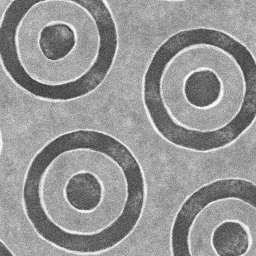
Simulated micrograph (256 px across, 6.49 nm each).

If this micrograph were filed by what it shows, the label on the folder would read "ring-shaped grooves with a dot in the middle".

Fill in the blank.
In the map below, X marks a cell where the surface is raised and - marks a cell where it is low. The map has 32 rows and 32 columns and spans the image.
X---XXXXXX---XXXXXXXXXXXXXXXXXXX
X--XXXXXXXX---XXXXXXXXXXXXXXXXXX
---XXXXXXXXX--XXXXXXXXXXXXXXXXXX
--XXXX---XXX--XXXXXXXXXXXXXXXXXX
--XXX----XXX---XXXXXX--------XXX
--XXX----XXX---XXXXX----------XX
--XXX----XXX--XXXXXX---XXXXX---X
--XXXX-XXXXX--XXXXX--XXXXXXXX---
X--XXXXXXXX---XXXXX--XXXXXXXXX--
X---XXXXXX---XXXXX--XXXX---XXX--
XX---XXX-----XXXXX--XXX-----XXX-
XXXX-------XXXXXXX--XXX-----XXX-
XXXXXXX-XXXXXXXXXX--XXX----XXX--
XXXXXXXXXXXXXXXXXX---XXXXXXXXX--
XXXXXXXXXXXXXXXXXXX--XXXXXXXX---
XXXXXXXXXXXXXXXXXXX---XXXXXX---X
XXXXXXXXX---XXXXXXXX----------XX
XXXXXXX--------XXXXXX--------XXX
XXXXX-----------XXXXXXX-----XXXX
XXXX---XXXXXX----XXXXXXXXXXXXXXX
XXXX--XXXXXXXXX--XXXXXXXXXXXXXXX
XXX---XXXXXXXXX---XXXXXXXXXXXXXX
XXX--XXXX---XXXX--XXXXXXXXX----X
XXX--XXX-----XXX--XXXXXXX-------
XXX--XXX-----XXX--XXXXXX--------
XXX--XXXX---XXXX--XXXXX---XXXXX-
XXX---XXXXXXXXX---XXXX---XXXXXXX
XXXX--XXXXXXXX---XXXXX--XXXXXXXX
XXXX----XXXXX----XXXXX--XXX----X
XXXXX-----------XXXXX---XXX----X
XXXXXXX-------XXXXXXX---XXX----X
-XXXXXXXX---XXXXXXXXX---XXX----X